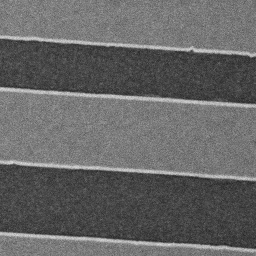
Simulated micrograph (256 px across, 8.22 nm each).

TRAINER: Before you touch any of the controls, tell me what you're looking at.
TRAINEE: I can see one or a few lines or trenches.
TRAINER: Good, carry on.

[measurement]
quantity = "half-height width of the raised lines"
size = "603 nm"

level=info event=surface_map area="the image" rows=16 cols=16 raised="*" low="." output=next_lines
****************
****************
...*************
................
................
................
**************..
****************
****************
****************
.....***********
................
................
................
................
***************.